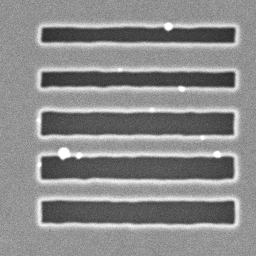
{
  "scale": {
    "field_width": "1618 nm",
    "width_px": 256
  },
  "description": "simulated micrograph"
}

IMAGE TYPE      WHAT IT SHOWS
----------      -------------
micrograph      groups of lines, slits or small figures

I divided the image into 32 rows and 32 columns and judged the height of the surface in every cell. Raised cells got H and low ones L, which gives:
HHHHHHHHHHHHHHHHHHHHHHHHHHHHHHHH
HHHHHHHHHHHHHHHHHHHHHHHHHHHHHHHH
HHHHHHHHHHHHHHHHHHHHHHHHHHHHHHHH
HHHHHHLLLLLLLLLLLLLLHHLLLLLLLHHH
HHHHHLLLLLLLLLLLLLLLLLLLLLLLLHHH
HHHHHHHHHHHHHHHHHHHHHHHHHHHHHHHH
HHHHHHHHHHHHHHHHHHHHHHHHHHHHHHHH
HHHHHHHHHHHHHHHHHHHHHHHHHHHHHHHH
HHHHHHHHHHHHHHHHHHHHHHHHHHHHHHHH
HHHHHLLLLLLLLLLLLLLLLLLLLLLLLHHH
HHHHHLLLLLLLLLLLLLLLLLLLLLLLLHHH
HHHHHHHHHHHHHHHHHHHHHHHHHHHHHHHH
HHHHHHHHHHHHHHHHHHHHHHHHHHHHHHHH
HHHHHHHHHHHHHHHHHHHHHHHHHHHHHHHH
HHHHHLLLLLLLLLLLLLLLLLLLLLLLLHHH
HHHHHLLLLLLLLLLLLLLLLLLLLLLLLHHH
HHHHHLLLLLLLLLLLLLLLLLLLLLLLLHHH
HHHHHHHHHHHHHHHHHHHHHHHHHHHHHHHH
HHHHHHHHHHHHHHHHHHHHHHHHHHHHHHHH
HHHHHHLHHHHHHHHHHLLLHHHHHHHHLHHH
HHHHHLLLLLLLLLLLLLLLLLLLLLLLLHHH
HHHHHLLLLLLLLLLLLLLLLLLLLLLLLHHH
HHHHHHLLLLLHHLLLLLLLLLLLLLLLLHHH
HHHHHHHHHHHHHHHHHHHHHHHHHHHHHHHH
HHHHHHHHHHHHHHHHHHHHHHHHHHHHHHHH
HHHHHLLLLLLLLLLLLLLLLLLLLLLLLHHH
HHHHHLLLLLLLLLLLLLLLLLLLLLLLLLHH
HHHHHLLLLLLLLLLLLLLLLLLLLLLLLHHH
HHHHHHHHHHHHHHHHHHHHHHHHHHHHHHHH
HHHHHHHHHHHHHHHHHHHHHHHHHHHHHHHH
HHHHHHHHHHHHHHHHHHHHHHHHHHHHHHHH
HHHHHHHHHHHHHHHHHHHHHHHHHHHHHHHH